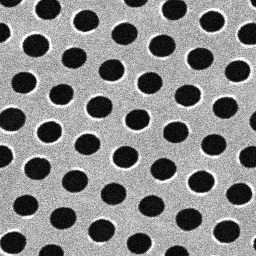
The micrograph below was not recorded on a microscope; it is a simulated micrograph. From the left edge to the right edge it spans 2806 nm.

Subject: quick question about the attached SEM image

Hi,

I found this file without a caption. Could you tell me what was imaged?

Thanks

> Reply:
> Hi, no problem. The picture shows a regular array of holes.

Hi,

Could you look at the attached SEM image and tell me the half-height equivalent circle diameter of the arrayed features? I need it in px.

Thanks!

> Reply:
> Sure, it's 24.6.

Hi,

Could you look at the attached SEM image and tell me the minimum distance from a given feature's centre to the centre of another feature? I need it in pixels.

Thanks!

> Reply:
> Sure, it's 38.7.